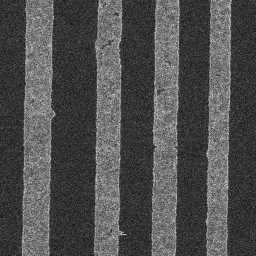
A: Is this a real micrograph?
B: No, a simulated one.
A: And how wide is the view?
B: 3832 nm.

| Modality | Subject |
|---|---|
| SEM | parallel lines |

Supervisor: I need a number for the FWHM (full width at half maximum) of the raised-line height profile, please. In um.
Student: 0.342